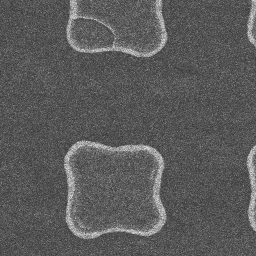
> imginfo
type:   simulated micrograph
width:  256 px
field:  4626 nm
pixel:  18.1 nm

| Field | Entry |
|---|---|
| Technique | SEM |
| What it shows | raised bodies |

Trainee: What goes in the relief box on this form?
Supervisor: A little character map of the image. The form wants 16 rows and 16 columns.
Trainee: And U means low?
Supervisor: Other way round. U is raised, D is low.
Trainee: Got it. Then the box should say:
DDDDDUUUUUDDDDDD
DDDDUUUUUUDDDDDD
DDDDUUUUUUDDDDDD
DDDDDDDDDDDDDDDD
DDDDDDDDDDDDDDDD
DDDDDDDDDDDDDDDD
DDDDDDDDDDDDDDDD
DDDDDDDDDDDDDDDD
DDDDDDDDDDDDDDDD
DDDDUUUUUUDDDDDD
DDDDUUUUUUDDDDDD
DDDDUUUUUUDDDDDD
DDDDUUUUUUDDDDDD
DDDDUUUUUUDDDDDD
DDDDDUUDUDDDDDDD
DDDDDDDDDDDDDDDD